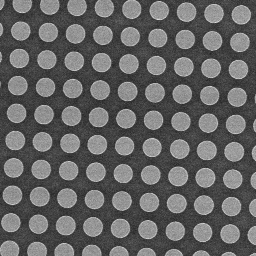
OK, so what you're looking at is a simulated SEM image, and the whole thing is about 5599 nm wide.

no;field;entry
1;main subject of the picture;an array of small figures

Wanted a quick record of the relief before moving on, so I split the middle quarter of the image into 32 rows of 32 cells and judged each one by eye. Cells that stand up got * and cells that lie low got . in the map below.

.****..*****..*****..****...****
..*.....***...****...****...****
......................**....***.
................................
.***....**......................
****...****...****...***.....**.
****...****...****...****..*****
****...****...****..*****..*****
........**....****...****..*****
......................*.....***.
................................
****...***.....**...............
****..*****..*****...***....***.
****..*****..*****..*****..****.
****...****..*****..*****..****.
........**....***....***...****.
............................**..
................................
****...***....**................
****..*****..****...****...***..
****..*****..****...****...****.
***...****...****...****...****.
..............**....****...****.
.............................*..
**..............................
***...****...***.....*..........
***...****...****...****...***..
***...****...****..*****..*****.
***...****...****..*****..*****.
..............**....***....***..
................................
**..............................